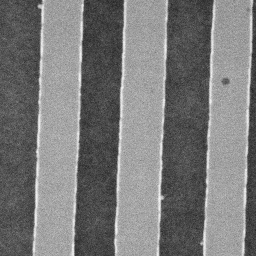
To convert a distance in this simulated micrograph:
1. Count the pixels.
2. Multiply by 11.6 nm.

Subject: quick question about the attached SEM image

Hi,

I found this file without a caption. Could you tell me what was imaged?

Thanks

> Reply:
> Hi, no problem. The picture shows lines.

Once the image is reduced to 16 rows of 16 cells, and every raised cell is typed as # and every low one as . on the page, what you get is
...##...##...###
...##...##...###
...##...##...###
...##...##...###
...##...##...###
..###...##...###
..###...##...###
..###...##...###
..###...##...##.
..###..###...##.
..###..###...##.
..###..###...##.
..###..###...##.
..###..###...##.
..###..###...##.
..###..###...##.